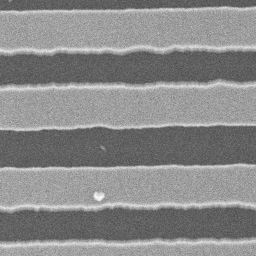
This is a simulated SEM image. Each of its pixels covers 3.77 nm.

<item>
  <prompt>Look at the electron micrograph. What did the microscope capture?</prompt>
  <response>lines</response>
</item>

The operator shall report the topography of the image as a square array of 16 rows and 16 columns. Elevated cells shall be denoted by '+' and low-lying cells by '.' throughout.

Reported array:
............++++
++++++++++++++++
++++++++++++++++
................
................
++++++++++++++++
++++++++++++++++
++++++++++++++++
................
................
+.++++++++++++++
++++++++++++++++
++++++++++++++++
................
................
++++++++++++++++